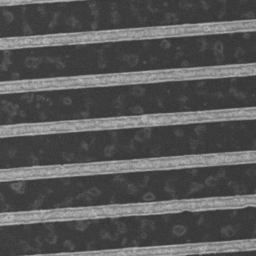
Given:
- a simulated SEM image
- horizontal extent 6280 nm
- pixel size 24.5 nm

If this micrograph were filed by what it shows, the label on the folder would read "parallel lines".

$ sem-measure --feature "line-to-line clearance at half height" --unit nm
801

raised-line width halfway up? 0.281 um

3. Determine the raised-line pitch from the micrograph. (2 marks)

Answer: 1070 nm